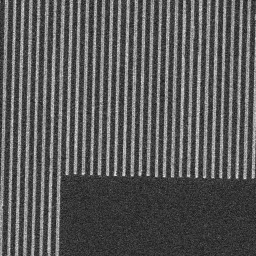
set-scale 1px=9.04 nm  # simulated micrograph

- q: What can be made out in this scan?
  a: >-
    parallel lines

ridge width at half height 0.0226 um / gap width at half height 53.1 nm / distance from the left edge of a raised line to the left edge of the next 72.9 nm